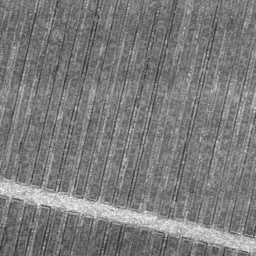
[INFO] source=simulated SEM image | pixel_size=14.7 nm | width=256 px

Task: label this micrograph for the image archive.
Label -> parallel lines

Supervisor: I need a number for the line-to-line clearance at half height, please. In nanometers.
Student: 89.7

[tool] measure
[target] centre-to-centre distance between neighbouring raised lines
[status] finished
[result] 0.215 microns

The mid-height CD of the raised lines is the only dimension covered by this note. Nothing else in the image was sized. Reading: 0.127 micrometres